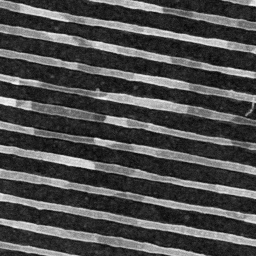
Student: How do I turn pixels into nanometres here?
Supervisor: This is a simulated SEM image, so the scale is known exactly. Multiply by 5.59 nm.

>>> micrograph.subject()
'parallel lines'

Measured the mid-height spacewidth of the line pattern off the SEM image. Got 96.9 nanometres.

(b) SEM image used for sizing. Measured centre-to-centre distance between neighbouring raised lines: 132 nm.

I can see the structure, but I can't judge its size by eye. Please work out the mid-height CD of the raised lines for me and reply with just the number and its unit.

37.1 nm